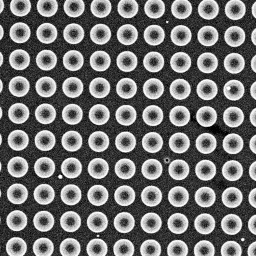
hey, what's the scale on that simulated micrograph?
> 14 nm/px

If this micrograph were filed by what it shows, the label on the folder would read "an array of small figures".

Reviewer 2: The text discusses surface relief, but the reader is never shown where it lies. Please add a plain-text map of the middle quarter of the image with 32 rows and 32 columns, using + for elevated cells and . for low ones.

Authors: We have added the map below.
++++...++++..+++++..+++++..++++.
.++.....++....+++....+++...++++.
................................
.++.............................
++++...++++...++++..++++...++++.
+++++.+++++..+++++..+++++..++++.
+++++.+++++..+++++..+++++..++++.
++++...++++..+++++..++++...++++.
...............+.....++.....++..
................................
.+++....++.....+......+.........
++++...++++..+++++..++++...++++.
++++..+++++..+++++..+++++..++++.
++++..+++++..+++++..+++++..++++.
.+++...++++...+++...++++...++++.
................................
................................
++++...+++....+++....+++....++..
++++..+++++..+++++..++++...++++.
++++..+++++..+++++..+++++.+++++.
++++..+++++..+++++..++++..+++++.
.++....+++....+++...++++...++++.
................................
.+..............................
++++...+++...++++...++++...+++..
++++..+++++..+++++..++++..+++++.
++++..+++++..+++++..++++..+++++.
++++..+++++..++++...++++..+++++.
........+.....++.....++....+++..
................................
+++.....+.....+.................
++++..+++++..++++...++++...++++.